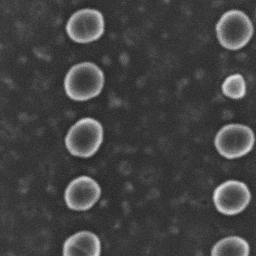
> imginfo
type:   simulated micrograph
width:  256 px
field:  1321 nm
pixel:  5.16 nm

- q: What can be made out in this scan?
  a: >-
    raised bodies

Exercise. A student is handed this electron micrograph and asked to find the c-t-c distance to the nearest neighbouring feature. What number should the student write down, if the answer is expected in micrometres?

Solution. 0.287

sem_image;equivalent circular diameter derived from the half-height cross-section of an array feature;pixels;35.1